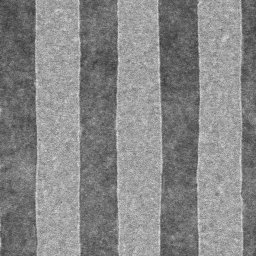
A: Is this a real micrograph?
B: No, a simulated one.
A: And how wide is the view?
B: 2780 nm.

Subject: one or a few lines or trenches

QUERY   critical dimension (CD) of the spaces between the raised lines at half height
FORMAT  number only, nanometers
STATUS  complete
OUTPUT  416